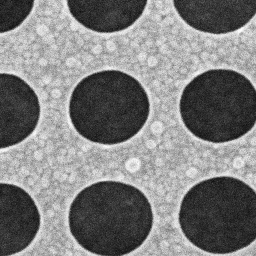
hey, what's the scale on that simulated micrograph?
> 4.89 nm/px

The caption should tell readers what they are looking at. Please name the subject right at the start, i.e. holes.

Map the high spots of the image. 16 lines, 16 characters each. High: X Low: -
--XX-----XX-----
-XXXX---XXXX---X
XXXXXXXXXXXXXXXX
XXXXXXXXXXXXXXXX
XXXXXX--XXXXX--X
--XXX----XXX----
--XX-----XX-----
--XX-----XX-----
--XXX---XXXX---X
XXXXXXXXXXXXXXXX
XXXXXXXXXXXXXXXX
-XXXXX--XXXX---X
--XXX----XX-----
---X------X-----
--XX-----XX-----
--XXX----XXX---X